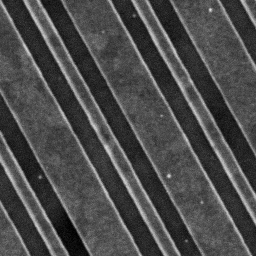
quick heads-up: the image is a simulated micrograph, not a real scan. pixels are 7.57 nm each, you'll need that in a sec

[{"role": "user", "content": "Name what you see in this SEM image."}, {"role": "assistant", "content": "lines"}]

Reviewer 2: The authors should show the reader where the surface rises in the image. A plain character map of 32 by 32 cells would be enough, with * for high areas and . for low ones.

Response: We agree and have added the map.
...**...******...**..*******..**
*...**..*******..**...******...*
*...**...******...**...******..*
**...**...******..**...******...
***..**...******...**...******..
***...**...******..**...******..
****..**...******...**...******.
****...**...******...**..******.
*****...**..******...**...******
*****...**...******...**..******
******...**..******...**...*****
******...**...******...**...****
.******...**..*******..**...****
.*******..**...******...**...***
..******...**...******..**...***
..*******..**...******...**...**
...******...**...******...**..**
*..*******...**..******...**...*
*...******...**...******...**..*
**..*******...**..******...**...
**...******...**...******...**..
.**...******...**...******..**..
.**...*******..**...******...**.
..**...******...**...******..**.
..**...*******..**...******...**
...**...******...**...******...*
*...**..*******...**..******...*
*...**...******...**...******...
**...**..*******...**..*******..
**...**...******...**...******..
***...**...******...**...******.
****..**...******...**...******.